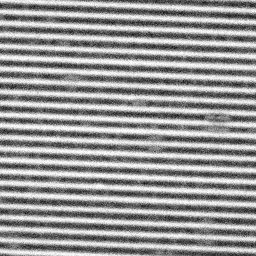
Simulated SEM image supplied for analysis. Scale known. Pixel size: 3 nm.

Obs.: parallel lines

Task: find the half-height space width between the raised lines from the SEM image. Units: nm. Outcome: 22.5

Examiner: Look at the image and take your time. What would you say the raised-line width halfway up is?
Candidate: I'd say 11.2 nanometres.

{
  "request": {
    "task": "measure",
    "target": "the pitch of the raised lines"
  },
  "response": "0.0343 microns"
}